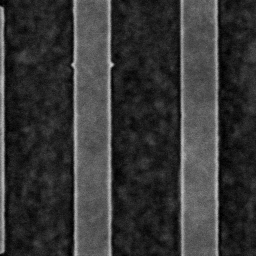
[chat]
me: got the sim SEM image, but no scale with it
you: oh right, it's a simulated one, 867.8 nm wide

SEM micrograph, one or a few lines or trenches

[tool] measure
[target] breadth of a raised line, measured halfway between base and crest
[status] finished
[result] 0.12 µm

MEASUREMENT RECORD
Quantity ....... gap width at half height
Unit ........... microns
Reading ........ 0.243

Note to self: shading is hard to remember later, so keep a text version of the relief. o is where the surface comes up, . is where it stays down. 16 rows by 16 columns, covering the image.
.....oo....ooo..
.....oo....ooo..
.....oo....ooo..
.....oo....ooo..
.....oo....ooo..
.....oo....ooo..
.....oo....ooo..
.....oo....ooo..
.....oo....ooo..
.....oo....ooo..
.....oo....ooo..
.....oo....ooo..
.....oo....ooo..
.....oo....ooo..
.....oo....ooo..
.....oo....ooo..